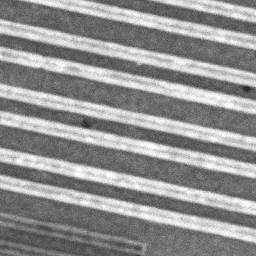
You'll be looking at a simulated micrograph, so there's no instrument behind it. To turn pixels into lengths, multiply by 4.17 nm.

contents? parallel lines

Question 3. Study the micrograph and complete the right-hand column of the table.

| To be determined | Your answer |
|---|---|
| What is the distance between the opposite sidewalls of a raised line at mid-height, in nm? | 40.8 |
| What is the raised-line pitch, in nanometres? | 131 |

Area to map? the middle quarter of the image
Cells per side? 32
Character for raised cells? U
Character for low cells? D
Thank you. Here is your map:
UUUUUDDDDDDDDDDDDDDDDDDDDDUUUUUU
UUUUUUUUUUDDDDDDDDDDDDDDDDDDDDDU
DDDUUUUUUUUUUDDDDDDDDDDDDDDDDDDD
DDDDDDDDUUUUUUUUUUDDDDDDDDDDDDDD
DDDDDDDDDDDDUUUUUUUUUUUDDDDDDDDD
DDDDDDDDDDDDDDDDDUUUUUUUUUUUUDDD
DDDDDDDDDDDDDDDDDDDDDDUUUUUUUUUU
DDDDDDDDDDDDDDDDDDDDDDDDDDDUUUUU
DDDDDDDDDDDDDDDDDDDDDDDDDDDDDDDU
UUUDDDDDDDDDDDDDDDDDDDDDDDDDDDDD
UUUUUUUUDDDDDDDDDDDDDDDDDDDDDDDD
DUUUUUUUUUUUUDDDDDDDDDDDDDDDDDDD
DDDDDDUUUUUUUUUUUUDDDDDDDDDDDDDD
DDDDDDDDDDDUUUUUUUUUUUDDDDDDDDDD
DDDDDDDDDDDDDDDDUUUUUUUUUUUDDDDD
DDDDDDDDDDDDDDDDDDDDUUUUUUUUUUUU
UUUUDDDDDDDDDDDDDDDDDDDDDUUUUUUU
UUUUUUUUUDDDDDDDDDDDDDDDDDDDDDUU
DDDUUUUUUUUUUUDDDDDDDDDDDDDDDDDD
DDDDDDDUUUUUUUUUUUDDDDDDDDDDDDDD
DDDDDDDDDDDDUUUUUUUUUUUDDDDDDDDD
DDDDDDDDDDDDDDDDUUUUUUUUUUUUDDDD
DDDDDDDDDDDDDDDDDDDDDDUUUUUUUUUU
DDDDDDDDDDDDDDDDDDDDDDDDDDDUUUUU
DDDDDDDDDDDDDDDDDDDDDDDDDDDDDDDU
UUUDDDDDDDDDDDDDDDDDDDDDDDDDDDDD
UUUUUUUDDDDDDDDDDDDDDDDDDDDDDDDD
DDUUUUUUUUUUDDDDDDDDDDDDDDDDDDDD
DDDDDDUUUUUUUUUUUDDDDDDDDDDDDDDD
DDDDDDDDDDDUUUUUUUUUUUDDDDDDDDDD
DDDDDDDDDDDDDDDDUUUUUUUUUUUDDDDD
DDDDDDDDDDDDDDDDDDDDUUUUUUUUUUUU